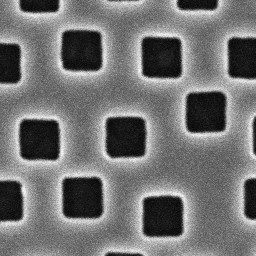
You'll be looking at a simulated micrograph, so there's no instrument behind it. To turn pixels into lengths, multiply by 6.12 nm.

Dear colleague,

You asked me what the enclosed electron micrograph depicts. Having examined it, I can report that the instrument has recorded holes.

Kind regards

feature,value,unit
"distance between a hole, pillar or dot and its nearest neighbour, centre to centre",442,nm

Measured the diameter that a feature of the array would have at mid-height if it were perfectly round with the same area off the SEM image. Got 282 nm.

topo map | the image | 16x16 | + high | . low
+...+++++++..+++
++++++++++++++++
++++..+++..+++..
.+++..+++..+++..
.++++++++..+++..
++++++++++++++++
++++++++++++..++
++.++++..+++..++
+...+++..+++++++
+...+++..+++++++
++++++++++++++++
.+++..+++++++++.
.+++..+++..++++.
.+++..+++..++++.
+++++++++..+++++
++++++++++++++++